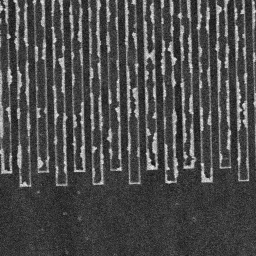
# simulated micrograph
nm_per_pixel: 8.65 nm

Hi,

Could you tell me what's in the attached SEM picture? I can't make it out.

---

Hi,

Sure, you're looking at parallel lines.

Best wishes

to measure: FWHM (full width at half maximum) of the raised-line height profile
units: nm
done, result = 96.2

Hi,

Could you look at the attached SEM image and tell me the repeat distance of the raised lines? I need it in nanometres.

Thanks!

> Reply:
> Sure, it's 158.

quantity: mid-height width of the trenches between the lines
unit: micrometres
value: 0.0638